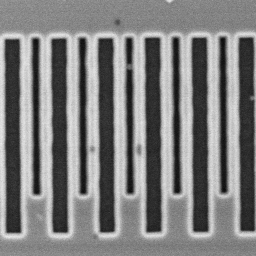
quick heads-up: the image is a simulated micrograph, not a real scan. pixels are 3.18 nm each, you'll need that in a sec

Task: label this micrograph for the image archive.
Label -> groups of lines, slits or small figures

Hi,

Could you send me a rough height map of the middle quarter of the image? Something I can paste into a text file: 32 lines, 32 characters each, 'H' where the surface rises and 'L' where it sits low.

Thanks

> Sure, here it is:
LHHLLLHHLLLLLHHLLLHHLLLLLHHLLHHL
LHHLLLHHLLLLLHHLLLHHLLLLLHHLLHHL
LHHLLLHHLLLLLHHLLLHHLLLLLHHLLHHL
LHHLLLHHLLLLLHHLLLHHLLLLLHHLLHHL
LHHLLLHHLLLLLHHLLLHHLLLLLHHLLHHH
LHHLLLHHLLLLLHHLLLHHLLLLLHHLLHHH
LHHLLLHHLLLLLHHLLLHHLLLLLHHLLHHH
LHHLLLHHLLLLLHHLLLHHLLLLLHHLLHHH
LHHLLLHHLLLLLHHLLLHHLLLLLHHLLHHH
LHHLLLHHLLLLLHHLLLHHLLLLLHHLLHHH
LHHLLLHHLLLLLHHLLLHHLLLLLHHLLHHH
LHHLLLHHLLLLLHHLLLHHLLLLLHHLLHHH
LHHLLLHHLLLLLHHLLLHHLLLLLHHLLHHH
LHHLLLHHLLLLLHHLLLHHLLLLLHHLLHHH
LHHLLLHHLLLLLHHLLLHHLLLLLHHLLHHH
LHHLLLHHLLLLLHHLLLHHLLLLLHHLLHHH
LHHLLLHHLLLLLHHLLLHHLLLLLHHLLHHH
LHHLLLHHLLLLLHHLLLHHLLLLLHHLLHHH
LHHLLLHHLLLLLHHLLLHHLLLLLHHLLHHH
LHHHLLHHLLLLLHHLLLHHLLLLLHHLLHHH
LHHLLLHHLLLLLHHLLLHHLLLLLHHLLHHH
LHHHLLHHLLLLLHHLLLHHLLLLLHHLLHHH
LHHHLLHHLLLLLHHLLLHHLLLLLHHLLHHH
LHHHLLHHLLLLLHHLLLHHLLLLLHHLLHHH
LHHHLLHHLLLLLHHLLLHHLLLLLHHLLHHH
LHHHLLHHLLLLLHHLLLHHLLLLLHHLLHHH
LHHHLLHHLLLLLHHLLLHHLLLLLHHLLHHH
LHHHLLHHLLLLLHHLLLHHLLLLLHHLLHHH
LHHHLLHHLLLLLHHLLLHHLLLLLHHLLHHH
LHHHLLHHLLLLLHHLLLHHLLLLLHHLLHHH
LHHHLLHHLLLLLHHLLLHHLLLLLHHLLHHH
LLHHLLHHLLLLLHHLLLHHLLLLLHHLLHHH